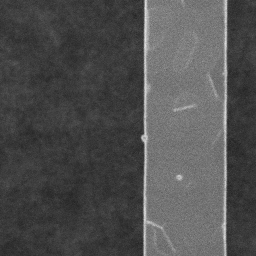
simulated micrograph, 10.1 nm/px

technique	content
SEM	wiring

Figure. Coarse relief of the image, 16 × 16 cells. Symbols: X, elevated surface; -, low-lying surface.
---------XXXXX--
---------XXXXX--
---------XXXXX--
---------XXXXX--
---------XXXXX--
---------XXXXX--
---------XXXXX--
---------XXXXX--
---------XXXXX--
---------XXXXX--
---------XXXXX--
---------XXXXX--
---------XXXXX--
---------XXXXX--
---------XXXXX--
---------XXXXX--